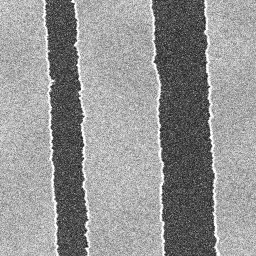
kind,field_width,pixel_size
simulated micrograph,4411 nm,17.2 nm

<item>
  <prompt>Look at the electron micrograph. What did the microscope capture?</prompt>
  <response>one or a few lines or trenches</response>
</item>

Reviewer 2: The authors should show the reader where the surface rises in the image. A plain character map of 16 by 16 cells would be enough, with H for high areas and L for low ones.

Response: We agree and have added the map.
HHHLLHHHHLLLLHHH
HHHLLHHHHHLLLHHH
HHHLLHHHHHLLLHHH
HHHLLHHHHHLLLHHH
HHHLLHHHHHLLLHHH
HHHLLHHHHHLLLHHH
HHHLLHHHHHLLLHHH
HHHLLHHHHHLLLHHH
HHHLLHHHHHLLLHHH
HHHLLHHHHHLLLHHH
HHHLLHHHHHLLLHHH
HHHLLHHHHHLLLHHH
HHHLLHHHHHLLLHHH
HHHLLHHHHHLLLHHH
HHHHLHHHHHLLLHHH
HHHHLLHHHHLLLLHH